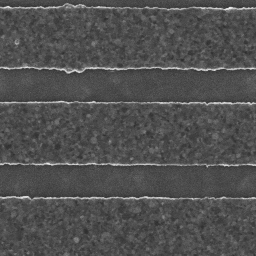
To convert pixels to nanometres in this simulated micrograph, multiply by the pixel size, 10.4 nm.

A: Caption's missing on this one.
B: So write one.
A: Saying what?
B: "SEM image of one or a few lines or trenches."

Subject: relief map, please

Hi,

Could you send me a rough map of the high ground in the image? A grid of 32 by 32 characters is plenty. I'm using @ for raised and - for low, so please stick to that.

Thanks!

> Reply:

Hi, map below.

--------------------------------
@@@@@@@@@@@@@@@@@@@@@@@@@@@@@@@@
@@@@@@@@@@@@@@@@@@@@@@@@@@@@@@@@
@@@@@@@@@@@@@@@@@@@@@@@@@@@@@@@@
@@@@@@@@@@@@@@@@@@@@@@@@@@@@@@@@
@@@@@@@@@@@@@@@@@@@@@@@@@@@@@@@@
@@@@@@@@@@@@@@@@@@@@@@@@@@@@@@@@
@@@@@@@@@@@@@@@@@@@@@@@@@@@@@@@@
@@@-@@@@@@@@@@@@@@@-@@@@@@@@@@@@
--------------------------------
--------------------------------
--------------------------------
--------------------------------
@@@@@@@@@@@@@@@@@@@@@@@@@@@@@@@@
@@@@@@@@@@@@@@@@@@@@@@@@@@@@@@@@
@@@@@@@@@@@@@@@@@@@@@@@@@@@@@@@@
@@@@@@@@@@@@@@@@@@@@@@@@@@@@@@@@
@@@@@@@@@@@@@@@@@@@@@@@@@@@@@@@@
@@@@@@@@@@@@@@@@@@@@@@@@@@@@@@@@
@@@@@@@@@@@@@@@@@@@@@@@@@@@@@@@@
@@@@@@@-@@@@@@@@@@@@@@@@@@@@@@@@
--------------------------------
--------------------------------
--------------------------------
--------------------------------
@@@@@@@@@@@@@@@@@@@@@@@@@@@@@@@@
@@@@@@@@@@@@@@@@@@@@@@@@@@@@@@@@
@@@@@@@@@@@@@@@@@@@@@@@@@@@@@@@@
@@@@@@@@@@@@@@@@@@@@@@@@@@@@@@@@
@@@@@@@@@@@@@@@@@@@@@@@@@@@@@@@@
@@@@@@@@@@@@@@@@@@@@@@@@@@@@@@@@
@@@@@@@@@@@@@@@@@@@@@@@@@@@@@@@@